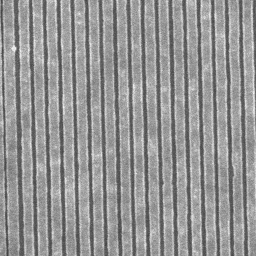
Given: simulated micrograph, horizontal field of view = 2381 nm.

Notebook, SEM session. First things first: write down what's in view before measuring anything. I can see parallel lines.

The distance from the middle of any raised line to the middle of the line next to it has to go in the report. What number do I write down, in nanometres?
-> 131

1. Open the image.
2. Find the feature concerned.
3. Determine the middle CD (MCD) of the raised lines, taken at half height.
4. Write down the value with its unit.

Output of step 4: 83.6 nm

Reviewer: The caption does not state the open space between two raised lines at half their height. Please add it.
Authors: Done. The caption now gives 0.05 um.